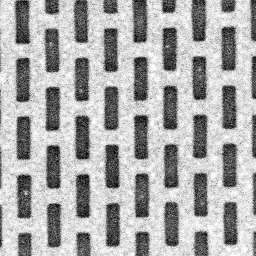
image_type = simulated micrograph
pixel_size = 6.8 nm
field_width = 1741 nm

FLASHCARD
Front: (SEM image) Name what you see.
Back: groups of lines, slits or small figures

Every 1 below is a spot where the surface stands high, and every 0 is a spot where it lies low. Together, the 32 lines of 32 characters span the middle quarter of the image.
11100011110000111000011110001111
11100011110000111000011110001111
11100011111111111000011111111111
11100011111111111000011111111111
11100011111111111000011111111111
11100011111001111000011110001111
11100011110000111000011110001111
11100011110000111000011110001111
11100011110000111000011110001111
11110111110000111111111110001111
11111111110000111111111110001111
11111111110000111111111110001111
11111111110000111111111110001111
11100011110000111000011110001111
11100001110000111000011110001111
11100001110000111000011110001111
11100001111001111000011111001111
11100001111111111000011111111111
11100001111111111000011111111111
11100001111111111000011111111111
11100001110000111000011110001111
11100001110000111000011110000111
11100001110000111000011110000111
11100011110000111100011110000111
11111111110000111111111110000111
11111111110000111111111110000111
11111111110000111111111110000111
11110011110000111100011110000111
11100001110000111100011110000111
11100001110000111100011110000111
11100001110000111100011110001111
11100001111111111100011111111111